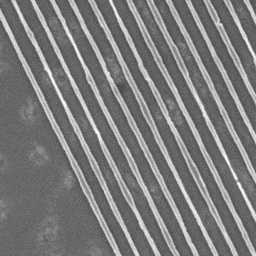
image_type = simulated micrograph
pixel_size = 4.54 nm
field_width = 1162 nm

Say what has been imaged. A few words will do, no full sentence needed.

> parallel lines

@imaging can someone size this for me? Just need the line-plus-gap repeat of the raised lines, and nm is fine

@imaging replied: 79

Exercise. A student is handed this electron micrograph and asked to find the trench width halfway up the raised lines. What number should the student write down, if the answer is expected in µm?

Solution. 0.059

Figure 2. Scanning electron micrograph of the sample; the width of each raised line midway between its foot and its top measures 20.4 nm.